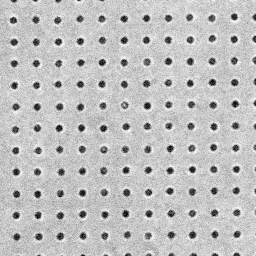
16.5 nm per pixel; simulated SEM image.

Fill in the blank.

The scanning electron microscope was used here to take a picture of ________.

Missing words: a regular array of holes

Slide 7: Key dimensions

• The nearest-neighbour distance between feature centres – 351 nm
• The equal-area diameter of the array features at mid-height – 138 nm